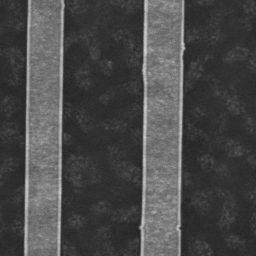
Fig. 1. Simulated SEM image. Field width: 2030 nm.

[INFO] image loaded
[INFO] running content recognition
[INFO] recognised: one or a few lines or trenches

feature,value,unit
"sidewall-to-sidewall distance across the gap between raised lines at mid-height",0.663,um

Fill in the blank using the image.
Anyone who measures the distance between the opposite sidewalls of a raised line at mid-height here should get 275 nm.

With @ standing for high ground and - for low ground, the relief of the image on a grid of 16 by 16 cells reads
--@@-----@@-----
--@@-----@@-----
--@@-----@@-----
--@@-----@@-----
--@@-----@@-----
--@@-----@@-----
--@@-----@@-----
--@@-----@@-----
--@@-----@@-----
--@@-----@@-----
--@@-----@@-----
--@@-----@@-----
--@@-----@@-----
--@@-----@@-----
--@@-----@@-----
--@@-----@@-----